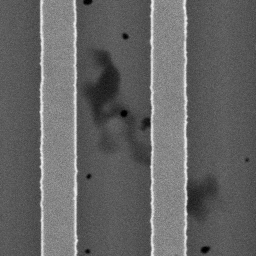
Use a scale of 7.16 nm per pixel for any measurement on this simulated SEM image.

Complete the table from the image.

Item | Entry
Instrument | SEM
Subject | lines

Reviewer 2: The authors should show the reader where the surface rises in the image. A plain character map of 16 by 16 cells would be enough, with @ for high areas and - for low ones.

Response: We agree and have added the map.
---@@----@@@----
---@@----@@@----
---@@----@@@----
---@@----@@@----
---@@----@@@----
---@@----@@@----
---@@----@@@----
---@@----@@@----
---@@----@@@----
---@@----@@@----
---@@----@@@----
---@@----@@@----
---@@----@@@----
---@@----@@@----
---@@----@@@----
---@@----@@@----